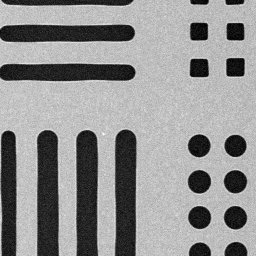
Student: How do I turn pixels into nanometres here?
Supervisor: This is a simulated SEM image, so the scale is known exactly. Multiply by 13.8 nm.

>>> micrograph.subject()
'groups of lines, slits or small figures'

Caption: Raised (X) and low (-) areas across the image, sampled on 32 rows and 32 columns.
X---------------XXXXXXXX--XXX-XX
XXXXXXXXXXXXXXXXXXXXXXXXXXXXXXXX
XXXXXXXXXXXXXXXXXXXXXXXXXXXXXXXX
-----------------XXXXXXX--XX---X
-----------------XXXXXXX--XX--XX
XXXXXXXXXXXXXXXXXXXXXXXXXXXXXXXX
XXXXXXXXXXXXXXXXXXXXXXXXXXXXXXXX
XXXXXXXXXXXXXXXXXXXXXXXX--XX--XX
-----------------XXXXXXX--XX---X
-----------------XXXXXXX--XXX-XX
XXXXXXXXXXXXXXXXXXXXXXXXXXXXXXXX
XXXXXXXXXXXXXXXXXXXXXXXXXXXXXXXX
XXXXXXXXXXXXXXXXXXXXXXXXXXXXXXXX
XXXXXXXXXXXXXXXXXXXXXXXXXXXXXXXX
XXXXXXXXXXXXXXXXXXXXXXXXXXXXXXXX
XXXXXXXXXXXXXXXXXXXXXXXXXXXXXXXX
--XXX--XXX--XXX--XXXXXXXXXXXXXXX
--XXX--XXX--XX---XXXXXXX--XX---X
--XXX--XXX--XX---XXXXXXX--XX---X
--XXX--XXX--XX---XXXXXXX--XXX-XX
--XXX--XXX--XX---XXXXXXXXXXXXXXX
--XXX--XXX--XX---XXXXXXX--XXX-XX
--XXX--XXX--XX---XXXXXX---XX---X
--XXX--XXX--XX---XXXXXXX--XX---X
--XXX--XXX--XX---XXXXXXXXXXXXXXX
--XXX--XXX--XX---XXXXXXXXXXXXXXX
--XXX--XXX--XX---XXXXXXX--XX---X
--XXX--XXX--XX---XXXXXXX--XX---X
--XXX--XXX--XX---XXXXXXX--XXX-XX
--XXX--XXX--XX---XXXXXXXXXXXXXXX
--XXX--XXX--XX---XXXXXXX--XXX-XX
--XXX--XXX--XX---XXXXXXX--XX---X